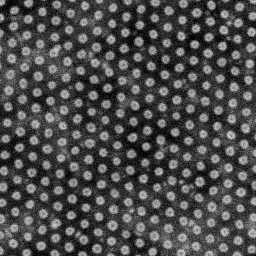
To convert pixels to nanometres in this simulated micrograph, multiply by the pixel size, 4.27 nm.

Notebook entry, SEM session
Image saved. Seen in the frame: a regular array of raised bodies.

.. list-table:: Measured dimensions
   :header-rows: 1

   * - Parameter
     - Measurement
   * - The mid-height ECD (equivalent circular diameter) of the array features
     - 30.1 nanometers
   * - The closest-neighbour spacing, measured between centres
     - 15.8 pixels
